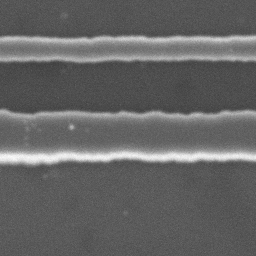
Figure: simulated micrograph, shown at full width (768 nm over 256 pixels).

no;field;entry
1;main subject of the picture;lines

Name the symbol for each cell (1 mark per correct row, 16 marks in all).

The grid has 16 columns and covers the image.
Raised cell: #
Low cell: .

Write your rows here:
................
................
################
################
................
................
................
################
################
################
................
................
................
................
................
................